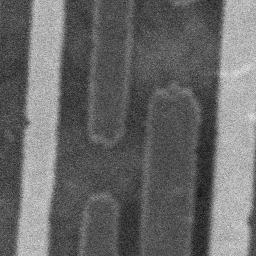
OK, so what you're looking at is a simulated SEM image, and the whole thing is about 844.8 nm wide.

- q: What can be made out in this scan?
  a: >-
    one or a few lines or trenches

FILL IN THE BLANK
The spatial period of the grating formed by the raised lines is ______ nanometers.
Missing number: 215